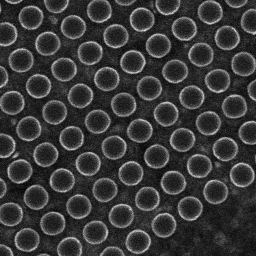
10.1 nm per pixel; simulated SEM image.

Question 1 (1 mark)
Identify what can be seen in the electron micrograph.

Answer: a regular array of raised bodies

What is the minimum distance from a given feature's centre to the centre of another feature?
308 nanometres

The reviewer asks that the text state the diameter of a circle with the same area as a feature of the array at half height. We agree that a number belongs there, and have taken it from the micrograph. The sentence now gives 239 nanometres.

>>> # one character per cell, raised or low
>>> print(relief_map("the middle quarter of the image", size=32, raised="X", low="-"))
XXX-----------XXXXXX-----XXXXX--
XXX------XXXX--XXXX------XXXXXX-
XXX-----XXXXX------------XXXXXX-
XX------XXXXXX------XXX--XXXXX--
--------XXXXXX-----XXXXX---XX---
---XXX--XXXXX-----XXXXXX--------
--XXXXX---X-------XXXXXX------XX
-XXXXXX-------XX---XXXXX-----XXX
-XXXXXX-----XXXXX---XXX------XXX
-XXXXXX-----XXXXXX-----------XXX
---XX-------XXXXXX-----XXXXX--XX
X-----------XXXXXX-----XXXXX----
X-----XXXX---XXXX------XXXXX----
-----XXXXXX------------XXXXX----
-----XXXXXX------XXXX---XXXX----
------XXXXX-----XXXXXX----------
XXXX--XXXX------XXXXXX------XXX-
XXXXX-----------XXXXXX-----XXXXX
XXXXX------XXX---XXXX------XXXXX
XXXXX-----XXXXX---X--------XXXXX
XXXX------XXXXX-------XX---XXXXX
----------XXXXX------XXXXX--XXX-
-----XXX--XXXXX-----XXXXXX------
---XXXXXX--XXX------XXXXXX------
---XXXXXX--------X--XXXXXX-----X
---XXXXXX------XXXX--XXXX------X
X---XXXXX-----XXXXX------------X
XX---XX-------XXXXXX-----XXXX---
XX------------XXXXX------XXXXX--
XX------XXXX---XXXX-----XXXXXX--
XX-----XXXXXX------------XXXXX--
X------XXXXXX------XXXX--XXXXX--